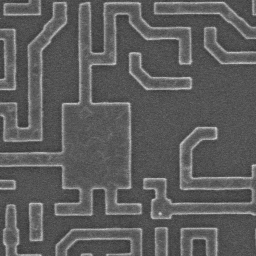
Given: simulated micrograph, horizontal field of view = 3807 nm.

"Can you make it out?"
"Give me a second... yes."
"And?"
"wiring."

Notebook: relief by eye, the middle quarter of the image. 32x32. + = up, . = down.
....+++..........++.............
....+++..........+++............
....+++..........++++...........
....+++...........++++++++...+++
....+++............+++++++++++++
....+++.............++++++++++++
....+++.........................
....+++.........................
....+++.........................
....+++.........................
++++++++++++++++................
+++++++++++++++++...............
+++++++++++++++++...............
+++++++++++++++++...............
+++++++++++++++++...............
+++++++++++++++++...............
+++++++++++++++++...............
+++++++++++++++++...............
+++++++++++++++++.............++
+++++++++++++++++.............++
+++++++++++++++++............+++
+++++++++++++++++............+++
+++++++++++++++++............+++
+++++++++++++++++............+++
+++++++++++++++++............+++
+++++++++++++++++............+++
+++++++++++++++++............+++
+++++++++++++++++............+++
+++++++++++++++++............+++
+++++++++++++++++...+++++....+++
+++++++++++++++++...+++++....+++
....+++...+++..........++.......